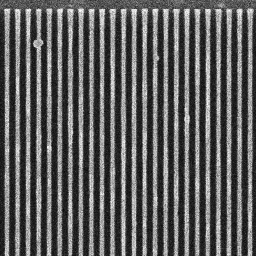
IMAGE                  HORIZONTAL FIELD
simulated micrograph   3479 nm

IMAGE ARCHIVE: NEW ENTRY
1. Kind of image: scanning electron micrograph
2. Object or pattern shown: parallel lines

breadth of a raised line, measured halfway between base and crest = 4.25 pixels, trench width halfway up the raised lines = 79.9 nm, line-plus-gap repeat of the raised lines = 144 nm